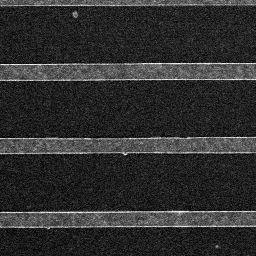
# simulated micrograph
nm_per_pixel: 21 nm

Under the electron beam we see one or a few lines or trenches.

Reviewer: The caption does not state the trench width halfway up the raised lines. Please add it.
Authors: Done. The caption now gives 1220 nanometres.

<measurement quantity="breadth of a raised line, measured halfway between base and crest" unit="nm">309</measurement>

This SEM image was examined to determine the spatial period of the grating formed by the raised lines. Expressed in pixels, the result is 73.6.